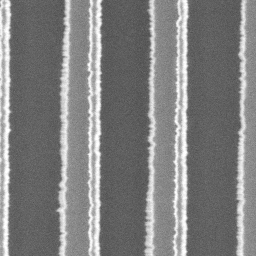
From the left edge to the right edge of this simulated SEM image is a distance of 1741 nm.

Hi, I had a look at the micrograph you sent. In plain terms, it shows lines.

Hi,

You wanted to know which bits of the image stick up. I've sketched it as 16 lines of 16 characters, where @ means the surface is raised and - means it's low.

@---@@----@@---@
@---@@----@@---@
@---@@----@@---@
@---@@----@@---@
@---@@----@@---@
@---@@----@@---@
@---@@----@@---@
@---@@----@@---@
@---@@----@@---@
----@@----@@---@
@---@@---@@@---@
----@@---@@@---@
@---@@---@@@---@
----@@---@@@---@
----@@---@@@---@
----@@---@@@---@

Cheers